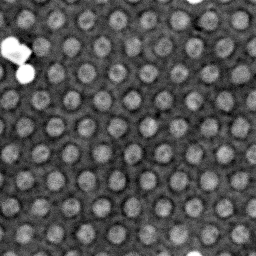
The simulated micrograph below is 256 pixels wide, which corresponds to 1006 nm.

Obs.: a regular array of raised bodies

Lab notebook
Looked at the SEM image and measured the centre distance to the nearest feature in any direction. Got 120 nm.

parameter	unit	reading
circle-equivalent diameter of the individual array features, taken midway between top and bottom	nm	68.3